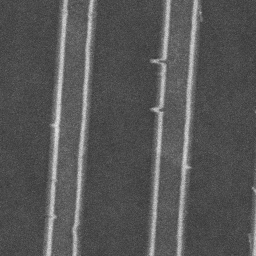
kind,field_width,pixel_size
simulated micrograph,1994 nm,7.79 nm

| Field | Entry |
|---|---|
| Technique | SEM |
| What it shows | one or a few lines or trenches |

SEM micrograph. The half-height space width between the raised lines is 598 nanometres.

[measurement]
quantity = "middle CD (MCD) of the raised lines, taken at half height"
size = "209 nanometres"